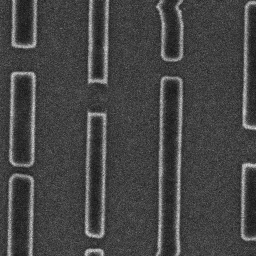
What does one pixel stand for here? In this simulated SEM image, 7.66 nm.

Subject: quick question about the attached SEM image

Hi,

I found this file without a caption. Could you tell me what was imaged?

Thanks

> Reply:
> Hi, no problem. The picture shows one or a few lines or trenches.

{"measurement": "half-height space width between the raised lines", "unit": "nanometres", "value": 430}